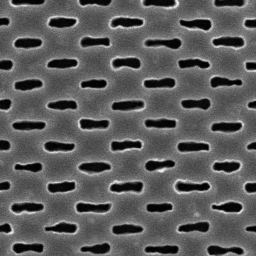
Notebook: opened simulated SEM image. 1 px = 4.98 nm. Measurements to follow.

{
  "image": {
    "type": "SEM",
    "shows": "a regular array of holes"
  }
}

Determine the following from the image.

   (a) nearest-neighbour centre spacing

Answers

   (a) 186 nanometers